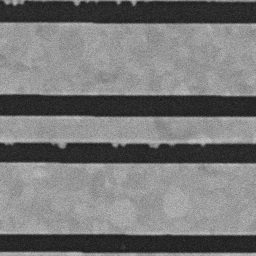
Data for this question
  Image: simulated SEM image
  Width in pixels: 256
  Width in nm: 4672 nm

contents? lines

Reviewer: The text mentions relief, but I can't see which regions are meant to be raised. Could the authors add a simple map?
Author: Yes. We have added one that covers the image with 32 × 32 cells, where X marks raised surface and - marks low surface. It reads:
--------------------------------
--------------------------------
--------------------------------
XXXXXXXXXXXXXXXXXXXXXXXXXXXXXXXX
XXXXXXXXXXXXXXXXXXXXXXXXXXXXXXXX
XXXXXXXXXXXXXXXXXXXXXXXXXXXXXXXX
XXXXXXXXXXXXXXXXXXXXXXXXXXXXXXXX
XXXXXXXXXXXXXXXXXXXXXXXXXXXXXXXX
XXXXXXXXXXXXXXXXXXXXXXXXXXXXXXXX
XXXXXXXXXXXXXXXXXXXXXXXXXXXXXXXX
XXXXXXXXXXXXXXXXXXXXXXXXXXXXXXXX
XXXXXXXXXXXXXXXXXXXXXXXXXXXXXXXX
--------------------------------
--------------------------------
--------------------------------
XXXXXXXXXXXXXXXXXXXXXXXXXXXXXXXX
XXXXXXXXXXXXXXXXXXXXXXXXXXXXXXXX
XXXXXXXXXXXXXXXXXXXXXXXXXXXXXXXX
--------------------------------
--------------------------------
XXXXXXXX------------------------
XXXXXXXXXXXXXXXXXXXXXXXXXXXXXXXX
XXXXXXXXXXXXXXXXXXXXXXXXXXXXXXXX
XXXXXXXXXXXXXXXXXXXXXXXXXXXXXXXX
XXXXXXXXXXXXXXXXXXXXXXXXXXXXXXXX
XXXXXXXXXXXXXXXXXXXXXXXXXXXXXXXX
XXXXXXXXXXXXXXXXXXXXXXXXXXXXXXXX
XXXXXXXXXXXXXXXXXXXXXXXXXXXXXXXX
XXXXXXXXXXXXXXXXXXXXXXXXXXXXXXXX
--------------------------------
--------------------------------
--------------------------------